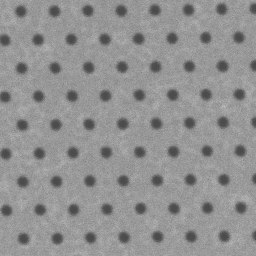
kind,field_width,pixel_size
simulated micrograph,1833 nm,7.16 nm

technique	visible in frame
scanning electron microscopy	a regular array of holes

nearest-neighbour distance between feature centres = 234 nm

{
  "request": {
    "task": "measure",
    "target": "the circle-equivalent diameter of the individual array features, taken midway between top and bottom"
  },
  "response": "0.0824 µm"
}